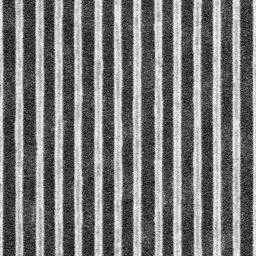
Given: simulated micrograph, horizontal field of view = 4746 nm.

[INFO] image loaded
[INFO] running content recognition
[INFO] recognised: parallel lines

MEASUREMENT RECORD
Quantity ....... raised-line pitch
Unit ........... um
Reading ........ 0.366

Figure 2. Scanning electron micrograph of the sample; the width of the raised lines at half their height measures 107 nm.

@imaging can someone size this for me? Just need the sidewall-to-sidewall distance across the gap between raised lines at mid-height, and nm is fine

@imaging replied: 262